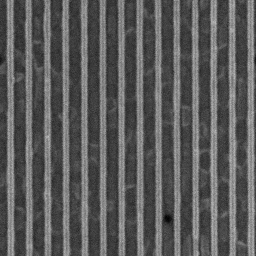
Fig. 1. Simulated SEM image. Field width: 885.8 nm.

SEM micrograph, parallel lines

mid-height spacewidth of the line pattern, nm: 48.1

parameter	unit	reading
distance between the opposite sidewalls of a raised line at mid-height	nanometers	16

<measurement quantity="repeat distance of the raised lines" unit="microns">0.064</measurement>